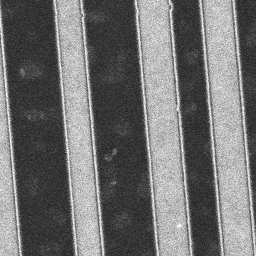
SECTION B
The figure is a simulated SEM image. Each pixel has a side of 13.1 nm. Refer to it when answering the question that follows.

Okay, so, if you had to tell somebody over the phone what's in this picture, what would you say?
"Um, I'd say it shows one or a few lines or trenches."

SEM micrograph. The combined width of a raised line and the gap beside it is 1.03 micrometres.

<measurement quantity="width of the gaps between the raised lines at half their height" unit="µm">0.416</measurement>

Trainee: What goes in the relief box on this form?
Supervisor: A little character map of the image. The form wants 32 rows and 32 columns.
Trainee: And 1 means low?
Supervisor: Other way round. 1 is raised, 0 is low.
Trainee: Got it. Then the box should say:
11111110001111111000011110000111
11111110001111111000011110000111
11111110001111111000011110000111
11111110001111111000011110000111
11111110000111111000001110000011
11111110000111111000001111000011
11111110000111111100001111000011
11111110000111111100001111000011
01111111000111111100001111000011
01111111000111111100001111000011
01111111000111111100001111000011
01111111000111111100001111000011
01111111000111111100001111000011
01111111000111111100001111000011
01111111000111111100001111000011
01111111000111111100001111000011
01111111000011111100000111100001
01111111000011111100000111100001
01111111100011111110000111100001
00111111100011111110000111100001
00111111100011111110000111100001
00111111100011111110000111100001
00111111100011111110000111100001
00111111100011111110000111100001
00111111100011111110000111100001
00111111100011111110000111100001
00111111100011111110000111100001
00111111100001111110000011100000
00111111100001111110000011110000
00111111100001111111000011110000
00111111110001111111000011110000
00011111110001111111000011110000